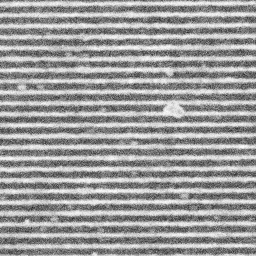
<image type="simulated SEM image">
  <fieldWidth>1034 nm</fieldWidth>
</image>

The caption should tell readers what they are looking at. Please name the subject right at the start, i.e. parallel lines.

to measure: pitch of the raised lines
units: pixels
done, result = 11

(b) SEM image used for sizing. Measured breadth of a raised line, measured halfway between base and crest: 0.0111 microns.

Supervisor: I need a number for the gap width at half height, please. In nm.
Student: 33.9